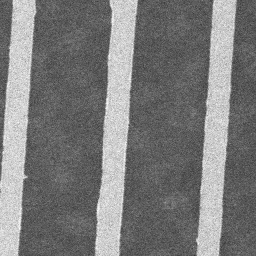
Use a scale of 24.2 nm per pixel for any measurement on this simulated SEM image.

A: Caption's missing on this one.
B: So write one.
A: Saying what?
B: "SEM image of one or a few lines or trenches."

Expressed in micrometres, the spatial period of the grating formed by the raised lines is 2.43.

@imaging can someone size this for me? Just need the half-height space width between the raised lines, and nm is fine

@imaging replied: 1900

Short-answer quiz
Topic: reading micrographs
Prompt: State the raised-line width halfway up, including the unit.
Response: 528 nm